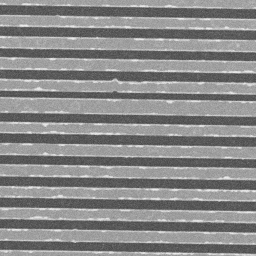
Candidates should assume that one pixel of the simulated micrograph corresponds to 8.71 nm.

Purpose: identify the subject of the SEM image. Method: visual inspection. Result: parallel lines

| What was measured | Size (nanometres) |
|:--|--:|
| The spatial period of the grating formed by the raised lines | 186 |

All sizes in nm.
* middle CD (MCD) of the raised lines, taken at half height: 103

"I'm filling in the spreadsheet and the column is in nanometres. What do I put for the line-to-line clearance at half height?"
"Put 88.2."